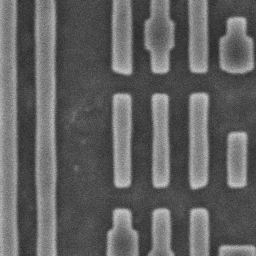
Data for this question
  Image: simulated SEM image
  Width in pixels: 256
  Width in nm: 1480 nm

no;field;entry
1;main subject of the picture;wiring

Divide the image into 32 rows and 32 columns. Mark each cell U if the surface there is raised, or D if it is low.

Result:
UUDDDUUDDDDDDDUUDDDUUDDDUUDDDDDD
UUDDDUUDDDDDDDUUDDDUUDDDUUDDDDDD
UUDDDUUDDDDDDDUUDDUUUDDDUUDDDUUD
UUDDDUUDDDDDDDUUDDUUUUDDUUDDUUUD
UUDDDUUDDDDDDDUUDDUUUUDDUUDDUUUD
UUDDDUUDDDDDDDUUDDUUUUDDUUDDUUUD
UUDDDUUDDDDDDDUUDDDUUDDDUUDDUUUU
UUDDDUUDDDDDDDUUDDDUUDDDUUDDUUUU
UUDDDUUDDDDDDDUUDDDUUDDDUUDDUUUD
UUDDDUUDDDDDDDDDDDDDDDDDDDDDDDDD
UUDDDUUDDDDDDDDDDDDDDDDDDDDDDDDD
UUDDDUUDDDDDDDDDDDDDDDDDDDDDDDDD
UUDDDUUDDDDDDDUUDDDUUDDDUUDDDDDD
UUDDDUUDDDDDDDUUDDDUUDDDUUDDDDDD
UUDDDUUDDDDDDDUUDDDUUDDDUUDDDDDD
UUDDDUUDDDDDDDUUDDDUUDDDUUDDDDDD
UUDDDUUDDDDDDDUUDDDUUDDDUUDDDDDD
UUDDDUUDDDDDDDUUDDDUUDDDUUDDDUUD
UUDDDUUDDDDDDDUUDDDUUDDDUUDDDUUD
UUDDDUUDDDDDDDUUDDDUUDDDUUDDDUUD
UUDDDUUDDDDDDDUUDDDUUDDDUUDDDUUD
UUDDDUUDDDDDDDUUDDDUUDDDUUDDDUUD
UUDDDUUDDDDDDDUUDDDUUDDDUUDDDUUD
UUDDDUUDDDDDDDDDDDDDDDDDUDDDDDDD
UUDDDUUDDDDDDDDDDDDDDDDDDDDDDDDD
UUDDDUUDDDDDDDDDDDDDDDDDDDDDDDDD
UUDDDUUDDDDDDDUUDDDUUDDDUUDDDDDD
UUDDDUUDDDDDDDUUDDDUUDDDUUDDDDDD
UUDDDUUDDDDDDDUUUDDUUDDDUUDDDDDD
UUDDDUUDDDDDDDUUUDDUUDDDUUDDDDDD
UUDDDUUDDDDDDDUUUDDUUDDDUUDDDDDD
UUDDDUUDDDDDDUUUUDDUUDDDUUDUUUUU